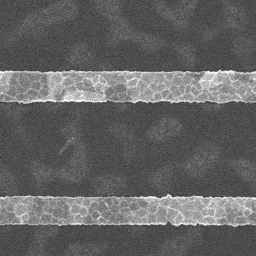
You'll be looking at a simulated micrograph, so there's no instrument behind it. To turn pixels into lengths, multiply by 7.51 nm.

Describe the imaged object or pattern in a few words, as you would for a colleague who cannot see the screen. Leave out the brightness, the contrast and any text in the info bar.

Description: one or a few lines or trenches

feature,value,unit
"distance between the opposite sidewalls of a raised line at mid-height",202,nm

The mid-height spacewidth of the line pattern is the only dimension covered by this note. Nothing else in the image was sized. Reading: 720 nm